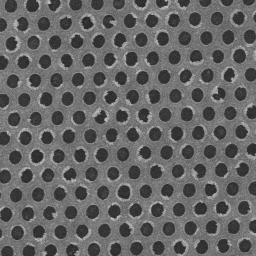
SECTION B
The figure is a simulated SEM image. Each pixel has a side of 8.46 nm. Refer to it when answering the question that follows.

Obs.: a regular array of holes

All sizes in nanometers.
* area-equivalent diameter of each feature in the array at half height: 114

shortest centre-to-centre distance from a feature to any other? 179 nm